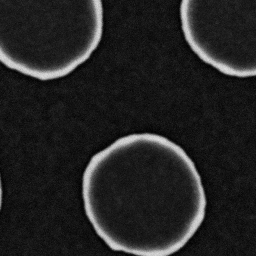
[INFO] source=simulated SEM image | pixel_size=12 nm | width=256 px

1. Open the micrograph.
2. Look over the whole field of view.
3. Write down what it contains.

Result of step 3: raised bodies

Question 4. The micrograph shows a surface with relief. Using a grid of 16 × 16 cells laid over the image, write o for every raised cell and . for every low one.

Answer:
oooooo.....ooooo
oooooo.....ooooo
oooooo......oooo
ooooo........ooo
..oo..........oo
................
................
................
................
.......oooo.....
......oooooo....
.....ooooooo....
.....oooooooo...
......ooooooo...
......oooooo....
.......oooo.....